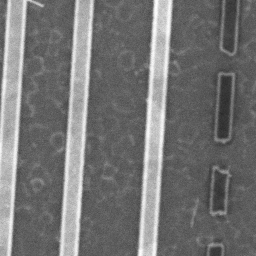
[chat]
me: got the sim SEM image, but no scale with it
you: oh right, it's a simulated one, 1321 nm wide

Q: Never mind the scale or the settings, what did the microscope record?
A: one or a few lines or trenches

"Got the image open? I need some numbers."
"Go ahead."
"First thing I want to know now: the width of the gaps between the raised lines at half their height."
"281 nm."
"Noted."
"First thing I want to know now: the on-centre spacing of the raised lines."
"378 nm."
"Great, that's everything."